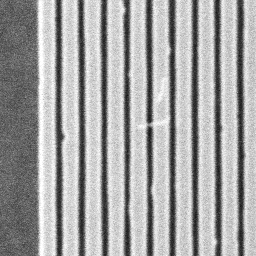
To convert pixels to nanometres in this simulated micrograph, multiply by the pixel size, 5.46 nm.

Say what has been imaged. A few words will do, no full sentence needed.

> parallel lines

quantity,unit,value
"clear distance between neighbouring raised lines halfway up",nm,40.2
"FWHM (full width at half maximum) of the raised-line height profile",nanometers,85.3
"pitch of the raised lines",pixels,22.7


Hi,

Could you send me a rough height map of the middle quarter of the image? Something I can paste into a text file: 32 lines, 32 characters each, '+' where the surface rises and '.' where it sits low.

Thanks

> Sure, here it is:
+++..++++..++++..+++..++++..++++
+++..++++..++++..+++..++++..++++
+++..++++..++++.++++..++++..++++
+++..++++..++++..+++..++++..++++
+++..++++..++++..+++..++++..++++
+++..++++..++++..+++..++++..++++
+++...+++..++++..+++..++++..++++
+++...+++..++++..+++..++++..++++
+++...+++..++++..+++..++++..++++
+++...+++..++++..+++..++++..++++
+++...+++..++++..+++..++++..++++
+++...+++..++++..+++..++++..++++
+++...+++..++++..+++..++++..++++
+++...+++..++++..+++..++++..++++
+++...+++..++++..+++..++++..++++
+++...+++..++++..++++.++++..++++
+++...+++..++++..+++..++++..++++
+++...+++..++++..+++..++++..++++
+++...+++..++++..+++..++++..++++
+++...+++..++++..+++..++++..++++
+++...+++..++++..+++..++++..++++
+++...+++..++++..+++..++++..++++
+++...+++..++++..+++..++++..++++
+++...+++..++++..+++..++++..++++
+++...+++..++++..+++..++++..++++
+++...+++..++++..+++..++++..++++
+++...+++..++++..+++..++++..++++
+++...+++..++++..+++..++++..++++
+++...+++..++++..+++..++++..++++
+++...+++..++++..+++..++++..++++
+++...+++..++++..+++..++++..++++
+++...+++..++++..+++..++++..++++